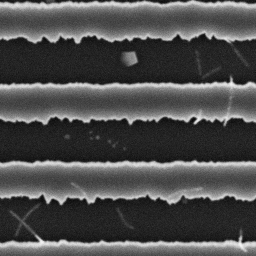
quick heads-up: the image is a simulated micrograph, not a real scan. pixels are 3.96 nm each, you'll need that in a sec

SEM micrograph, lines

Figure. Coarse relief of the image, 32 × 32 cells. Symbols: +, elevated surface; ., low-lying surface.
++++++++++++++++++++.++++++++++.
++++++++++++++++++++++++++++++++
++++++++++++++++++++++++++++++++
++++++++++++++++++++++++++++++++
+++++++++++++++++++++++++.++++++
................................
................................
................................
................................
................................
....+....++...+..+++++...++++..+
++++++++++++++++++++++++++++++++
++++++++++++++++++++++++++++++++
++++++++++++++++++++++++++++++++
++++++++++++++++++++++++++++++++
................................
................................
................................
................................
................................
++++++++++++++++++++++++++++++++
++++++++++++++++++++++++++++++++
++++++++++++++++++++++++++++++++
++++++++++++++++++++++++++++++++
++.+++++++++++++++.+++++++++.+++
................................
................................
................................
................................
................................
++++++++++++++++++++++++++++++++
++++++++++++++++++++++++++++++++